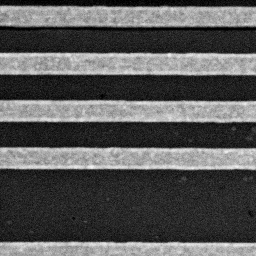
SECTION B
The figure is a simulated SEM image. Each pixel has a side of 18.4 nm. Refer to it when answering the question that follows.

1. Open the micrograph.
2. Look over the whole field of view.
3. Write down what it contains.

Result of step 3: wiring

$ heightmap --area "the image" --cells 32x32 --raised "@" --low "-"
--------------------------------
--------------------------------
--------------------------------
--------------------------------
--------------------------------
--------------------------------
--------------------------------
@@@@@@@@@@@@@@@@@@@@@@@@@@@@@@@@
@@@@@@@@@@@@@@@@@@@@@@@@@@@@@@@@
--------------------------------
--------------------------------
--------------------------------
--------------------------------
@@@@@@@@@@@@@@@@@@@@@@@@@@@@@@@@
@@@@@@@@@@@@@@@@@@@@@@@@@@@@@@@@
--------------------------------
--------------------------------
--------------------------------
--------------------------------
@@@@@@@@@@@@@@@@@@@@@@@@@@@@@@@@
@@@@@@@@@@@@@@@@@@@@@@@@@@@@@@@@
--------------------------------
--------------------------------
--------------------------------
--------------------------------
--------------------------------
--------------------------------
--------------------------------
--------------------------------
--------------------------------
--------------------------------
@@@@@@@@@@@@@@@@@@@@@@@@@@@@@@@@